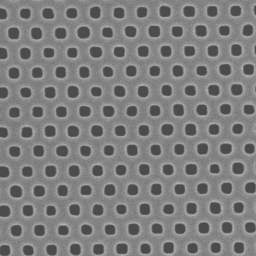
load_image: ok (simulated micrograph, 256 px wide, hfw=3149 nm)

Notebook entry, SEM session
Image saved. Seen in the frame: a regular array of holes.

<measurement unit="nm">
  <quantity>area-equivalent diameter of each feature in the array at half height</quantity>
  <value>141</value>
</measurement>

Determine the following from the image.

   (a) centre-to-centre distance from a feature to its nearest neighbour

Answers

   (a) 0.277 micrometres